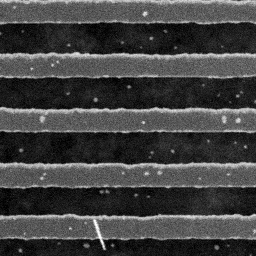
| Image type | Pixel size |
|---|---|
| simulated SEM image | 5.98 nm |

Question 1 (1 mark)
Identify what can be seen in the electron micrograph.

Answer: lines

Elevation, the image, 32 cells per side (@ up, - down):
@@@@@@@@@@@@@@@@@@@@@@@@@@@@@@@@
@@@@@@@@@@@@@@@@@@@@@@@@@@@@@@@@
@@@@@@@@@@@@@@@@@@@@@@@@@@@@@@@@
--------------------------------
--------------------------------
--------------------------------
--------------------------------
@@@@@@@@@@@@@@@@@@@@@@@@@@@@@@@@
@@@@@@@@@@@@@@@@@@@@@@@@@@@@@@@@
@@@@@@@@@@@@@@@@@@@@@@@@@@@@@@@@
--------------------------------
--------------------------------
--------------------------------
@-------------------------------
@@@@@@@@@@@@@@@@@@@@@@@@@@@@@@@@
@@@@@@@@@@@@@@@@@@@@@@@@@@@@@@@@
----@---------@@---------------@
--------------------------------
--------------------------------
--------------------------------
@@@-----@@@-@@@---@@--@@@@@@-@@@
@@@@@@@@@@@@@@@@@@@@@@@@@@@@@@@@
@@@@@@@@@@@@@@@@@@@@@@@@@@@@@@@@
--@-----------------------------
--------------------------------
--------------------------------
--------------------------------
@@@@@@@@@@@@@@@@@@@@@@@@@@@@@@@@
@@@@@@@@@@@@@@@@@@@@@@@@@@@@@@@@
@@@@@@@@@@@@@@@@@@@@@@@@@@@@@@@@
--------------------------------
--------------------------------